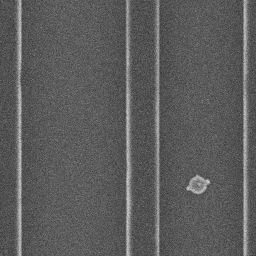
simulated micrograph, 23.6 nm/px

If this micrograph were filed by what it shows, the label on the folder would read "lines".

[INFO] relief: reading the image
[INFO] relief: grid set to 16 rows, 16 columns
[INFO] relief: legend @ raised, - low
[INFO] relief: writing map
@-------@@-----@
@-------@@-----@
@-------@@-----@
@-------@@-----@
@-------@@-----@
@-------@@-----@
@-------@@-----@
@-------@@-----@
@-------@@-----@
@-------@@-----@
@-------@@-----@
@-------@@-----@
@-------@@-----@
@-------@@-----@
@-------@@-----@
@-------@@-----@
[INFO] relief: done